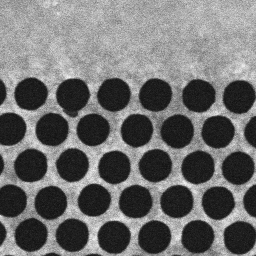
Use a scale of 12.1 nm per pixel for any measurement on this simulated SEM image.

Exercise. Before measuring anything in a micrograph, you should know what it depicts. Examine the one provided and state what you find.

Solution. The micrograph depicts a regular array of holes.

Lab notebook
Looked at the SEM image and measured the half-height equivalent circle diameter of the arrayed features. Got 33.2 pixels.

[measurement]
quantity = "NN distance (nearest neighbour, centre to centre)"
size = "0.485 µm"